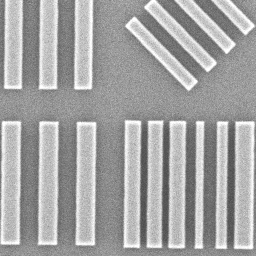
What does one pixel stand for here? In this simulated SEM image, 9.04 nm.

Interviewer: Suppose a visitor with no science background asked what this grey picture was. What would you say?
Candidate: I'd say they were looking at groups of lines, slits or small figures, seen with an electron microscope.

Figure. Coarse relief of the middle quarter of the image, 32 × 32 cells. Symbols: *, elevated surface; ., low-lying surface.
...****..................****...
...****...................*****.
...****....................****.
...****.....................****
...****......................***
...****.......................**
................................
................................
................................
................................
................................
................................
................................
................................
...............**...............
....****.......****..***...***..
....****.......****..***...***..
....****.......****..***...***..
....****.......****..***...***..
....****.......****..***...***..
....****.......****..***...***..
....****.......****..***...***..
....****.......****..***...***..
....****.......****..***...***..
...*****.......****..***...***..
....****.......****..***...***..
....****.......****..***...***..
...*****.......****..***...***..
...*****.......****..***...***..
...*****.......****..***...***..
...*****.......****..***...***..
...*****.......****..***...***..